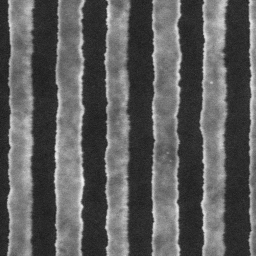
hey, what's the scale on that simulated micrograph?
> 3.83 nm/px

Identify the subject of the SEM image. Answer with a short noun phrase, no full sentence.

lines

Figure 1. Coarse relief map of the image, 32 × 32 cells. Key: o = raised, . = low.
.ooo...ooo...ooo...ooo...ooo...o
.ooo...ooo...ooo...ooo...ooo...o
.ooo...ooo...ooo...ooo...ooo...o
.ooo...ooo...ooo...ooo...ooo...o
.ooo...ooo...ooo...ooo....oo...o
.ooo...ooo...ooo...ooo....oo...o
.ooo...ooo...ooo...oooo..ooo...o
.ooo...ooo...ooo...oooo..ooo...o
.ooo...ooo...ooo...ooo...ooo...o
.ooo...ooo...ooo...ooo...ooo...o
.ooo...ooo...ooo...ooo...ooo...o
.ooo...ooo...ooo...ooo...ooo...o
.ooo...ooo...ooo...ooo...ooo...o
.ooo...ooo...ooo...ooo...ooo...o
.ooo...ooo...ooo...ooo...ooo...o
.ooo...ooo...ooo...ooo...ooo...o
.ooo...ooo...ooo...ooo...ooo...o
.ooo...ooo...ooo...ooo...ooo...o
.ooo...ooo...ooo...ooo...ooo...o
.ooo...ooo...ooo...ooo...ooo...o
.oo....ooo...ooo...ooo...ooo...o
.ooo...ooo...ooo...ooo...ooo...o
.ooo...ooo...ooo...ooo...ooo...o
.ooo...ooo...ooo...ooo...ooo...o
.ooo...ooo...ooo...ooo...ooo...o
.ooo...ooo...ooo...ooo...ooo...o
.ooo...ooo...ooo...ooo...ooo...o
.ooo...ooo...ooo...ooo...ooo...o
.ooo...ooo...ooo...ooo...ooo...o
.ooo...ooo...ooo...ooo....oo...o
.ooo...ooo...ooo...ooo...ooo...o
.ooo...ooo...ooo...ooo...ooo...o